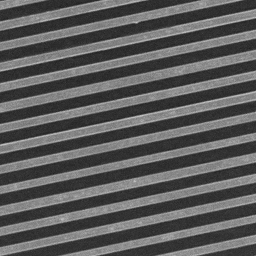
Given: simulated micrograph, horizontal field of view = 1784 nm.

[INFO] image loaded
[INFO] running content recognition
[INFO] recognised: parallel lines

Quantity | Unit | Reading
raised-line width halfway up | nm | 56.3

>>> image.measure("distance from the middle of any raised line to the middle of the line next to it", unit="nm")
140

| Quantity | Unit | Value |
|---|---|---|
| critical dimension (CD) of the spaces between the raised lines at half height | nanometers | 81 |